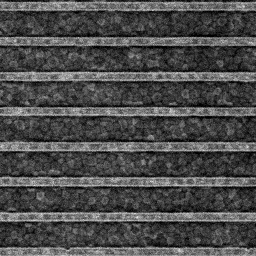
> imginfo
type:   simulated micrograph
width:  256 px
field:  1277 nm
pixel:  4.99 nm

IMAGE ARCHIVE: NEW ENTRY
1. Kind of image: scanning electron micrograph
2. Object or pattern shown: parallel lines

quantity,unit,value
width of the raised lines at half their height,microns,0.0399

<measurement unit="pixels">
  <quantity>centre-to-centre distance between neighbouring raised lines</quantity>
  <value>35.2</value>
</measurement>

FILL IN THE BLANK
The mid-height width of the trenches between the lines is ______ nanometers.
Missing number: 137